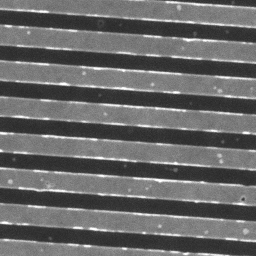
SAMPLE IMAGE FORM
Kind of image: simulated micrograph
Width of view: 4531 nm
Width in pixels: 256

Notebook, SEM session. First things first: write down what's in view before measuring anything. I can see parallel lines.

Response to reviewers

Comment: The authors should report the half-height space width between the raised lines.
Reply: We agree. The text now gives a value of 280 nm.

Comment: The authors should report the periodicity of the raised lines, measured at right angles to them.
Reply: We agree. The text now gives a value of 630 nm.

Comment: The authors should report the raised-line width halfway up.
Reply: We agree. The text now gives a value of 349 nm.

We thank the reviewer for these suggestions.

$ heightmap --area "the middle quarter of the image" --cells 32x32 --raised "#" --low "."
##..............................
################................
##############################..
################################
################################
....############################
..................##############
................................
................................
##..............................
###############.................
#############################...
################################
################################
.....###########################
...................#############
................................
................................
###.............................
#################...............
###############################.
################################
################################
.......#########################
.....................###########
................................
................................
####............................
##################..............
################################
################################
################################